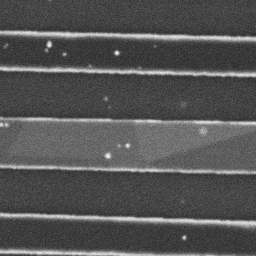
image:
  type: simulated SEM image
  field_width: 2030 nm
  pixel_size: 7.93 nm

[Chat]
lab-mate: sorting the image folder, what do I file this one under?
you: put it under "lines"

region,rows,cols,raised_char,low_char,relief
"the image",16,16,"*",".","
................
................
****************
****************
......**********
................
................
*******.........
****************
****************
****************
................
................
*****...........
****************
****************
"